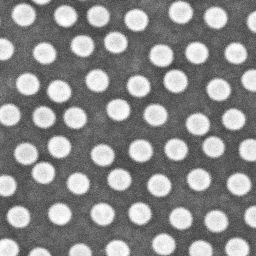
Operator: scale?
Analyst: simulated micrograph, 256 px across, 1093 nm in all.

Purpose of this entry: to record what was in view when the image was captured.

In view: a regular array of raised bodies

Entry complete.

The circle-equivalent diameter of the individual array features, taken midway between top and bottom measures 85.2 nm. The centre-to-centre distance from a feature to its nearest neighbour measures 142 nanometres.